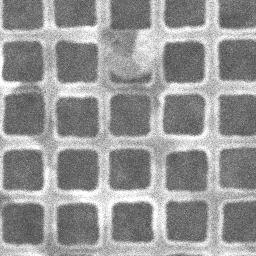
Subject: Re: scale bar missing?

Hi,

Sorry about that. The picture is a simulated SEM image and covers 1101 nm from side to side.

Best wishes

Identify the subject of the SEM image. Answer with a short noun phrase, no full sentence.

a regular array of holes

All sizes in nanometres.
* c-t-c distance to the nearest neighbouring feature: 226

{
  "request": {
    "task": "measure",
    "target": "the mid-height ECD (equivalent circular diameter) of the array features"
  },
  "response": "207 nanometres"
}